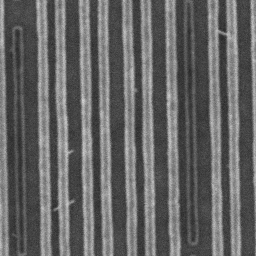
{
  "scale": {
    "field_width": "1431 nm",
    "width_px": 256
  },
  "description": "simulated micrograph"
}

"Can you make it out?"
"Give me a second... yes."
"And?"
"parallel lines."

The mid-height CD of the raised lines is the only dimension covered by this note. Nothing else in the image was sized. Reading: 40.5 nanometers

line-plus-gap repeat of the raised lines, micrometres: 0.12